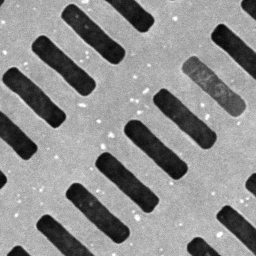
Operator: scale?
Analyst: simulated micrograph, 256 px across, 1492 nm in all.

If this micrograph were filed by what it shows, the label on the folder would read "a regular array of holes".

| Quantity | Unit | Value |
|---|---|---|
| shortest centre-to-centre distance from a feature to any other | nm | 250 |